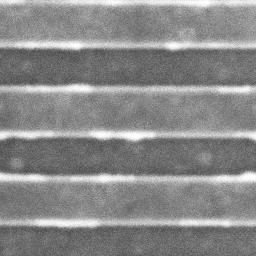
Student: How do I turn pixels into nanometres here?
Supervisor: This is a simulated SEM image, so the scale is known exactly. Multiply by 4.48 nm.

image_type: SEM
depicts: one or a few lines or trenches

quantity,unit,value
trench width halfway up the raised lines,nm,181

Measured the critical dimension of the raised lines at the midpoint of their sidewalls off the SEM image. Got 221 nm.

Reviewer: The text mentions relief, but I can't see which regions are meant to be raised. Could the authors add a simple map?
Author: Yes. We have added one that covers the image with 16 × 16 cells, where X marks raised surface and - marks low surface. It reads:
XXXXXXXXXXXXXXXX
XXXXXXXXXXXXXXXX
XXXXXXXXXXXXXXXX
----------------
----------------
XXXXXXXXXXXXXX-X
XXXXXXXXXXXXXXXX
XXXXXXXXXXXXXXXX
XXX---XXXXXX-XXX
----------------
----------------
XXXXXXXXXXXXXXXX
XXXXXXXXXXXXXXXX
XXXXXXXXXXXXXXXX
----------------
----------------